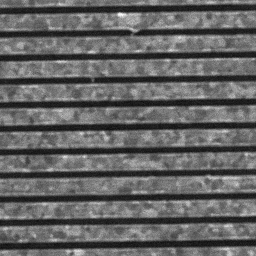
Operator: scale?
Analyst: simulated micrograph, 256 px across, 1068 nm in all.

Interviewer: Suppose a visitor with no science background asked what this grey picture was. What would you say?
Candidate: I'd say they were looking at parallel lines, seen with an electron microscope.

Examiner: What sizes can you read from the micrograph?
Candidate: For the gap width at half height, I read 32.3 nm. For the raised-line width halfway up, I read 65.1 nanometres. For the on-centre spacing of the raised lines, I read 23.5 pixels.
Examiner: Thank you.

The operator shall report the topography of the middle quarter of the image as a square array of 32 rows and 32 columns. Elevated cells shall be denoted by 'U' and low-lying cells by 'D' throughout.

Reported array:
UUUUUUUUUUUUUUUUUUUUUUUUUUUUUUUU
UUUUUUUUUUUUUUUUUUUUUUUUUUUUUUUU
UUUUUUUUUUUUUUUUUUUUUUUUUUUUUUUU
DDDDDDDDDDDDDDDDDDDDDDDDDDDDDDDD
DDDDDDDDDDDDDDDDDDDDDDDDDDDDDDDD
UUUUUUUUUUUUUUUUUUUUUUUUUUUUUUUU
UUUUUUUUUUUUUUUUUUUUUUUUUUUUUUUU
UUUUUUUUUUUUUUUUUUUUUUUUUUUUUUUU
UUUUUUUUUUUUUUUUUUUUUUUUUUUUUUUU
DDDDDDDDDDDDDDDDDDDDDDDDDDDDDDDD
DDDDDDDDDDDDDDDDDDDDDDDDDDDDDDDD
UUUUUUUUUUUUUUUUUUUUUUUUUUUUUUUU
UUUUUUUUUUUUUUUUUUUUUUUUUUUUUUUU
UUUUUUUUUUUUUUUUUUUUUUUUUUUUUUUU
UUUUUUUUUUUUUUUUUUUUUUUUUUUDDDDD
DDDDDDDDDDDDDDDDDDDDDDDDDDDDDDDD
DDDDDDDDDDDDDDDDDDDDDDDDDDDDDDDD
UUUUUUUUUUUUUUUUUUUUUUUUUUUUUUUU
UUUUUUUUUUUUUUUUUUUUUUUUUUUUUUUU
UUUUUUUUUUUUUUUUUUUUUUUUUUUUUUUU
UUUUUUUUUUUUUUUDDDDDDDDDDDDDDDDD
DDDDDDDDDDDDDDDDDDDDDDDDDDDDDDDD
DDDDDDDDDDDDDDDDDDDDDDDDDDDDDUUU
UUUUUUUUUUUUUUUUUUUUUUUUUUUUUUUU
UUUUUUUUUUUUUUUUUUUUUUUUUUUUUUUU
UUUUUUUUUUUUUUUUUUUUUUUUUUUUUUUU
UUUUDDDDDDDDDDDDDDDDDDDDDDDDDDDD
DDDDDDDDDDDDDDDDDDDDDDDDDDDDDDDD
DDDDDDDDDDDDDDDDDUUUUUUUUUUUDDDU
UUUUUUUUUUUUUUUUUUUUUUUUUUUUUUUU
UUUUUUUUUUUUUUUUUUUUUUUUUUUUUUUU
UUUUUUUUUUUUUUUUUUUUUUUUUUUUUUUU